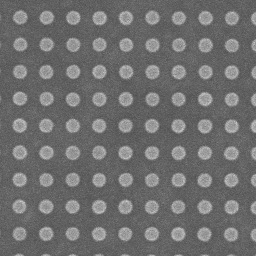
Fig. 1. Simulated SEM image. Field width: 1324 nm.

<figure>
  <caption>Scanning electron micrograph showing a regular array of raised bodies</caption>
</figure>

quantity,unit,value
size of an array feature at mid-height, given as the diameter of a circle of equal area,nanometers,66.7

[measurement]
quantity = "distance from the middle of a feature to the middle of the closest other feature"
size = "136 nm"